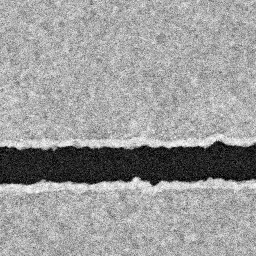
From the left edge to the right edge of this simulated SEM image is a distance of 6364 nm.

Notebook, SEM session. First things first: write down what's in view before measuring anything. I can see one or a few lines or trenches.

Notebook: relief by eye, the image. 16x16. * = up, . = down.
****************
****************
****************
****************
****************
****************
****************
****************
****************
................
................
.............*..
****************
****************
****************
****************